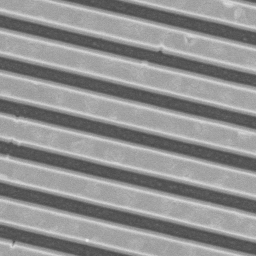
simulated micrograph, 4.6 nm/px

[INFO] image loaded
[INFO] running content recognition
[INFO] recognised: parallel lines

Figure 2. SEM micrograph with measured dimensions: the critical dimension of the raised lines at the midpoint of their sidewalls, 0.111 µm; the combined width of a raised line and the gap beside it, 40.9 px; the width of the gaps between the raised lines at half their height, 16.3 px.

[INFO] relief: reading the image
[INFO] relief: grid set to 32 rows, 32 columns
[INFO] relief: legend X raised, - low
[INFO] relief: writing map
XXXXXXXXX---------XXXXXXXXXXXXX-
XXXXXXXXXXXXX---------XXXXXXXXXX
----XXXXXXXXXXXXX---------XXXXXX
--------XXXXXXXXXXXXXX---------X
XXX----------XXXXXXXXXXXXX------
XXXXXXXX---------XXXXXXXXXXXXX--
XXXXXXXXXXXX---------XXXXXXXXXXX
---XXXXXXXXXXXXX---------XXXXXXX
-------XXXXXXXXXXXXX----------XX
XX----------XXXXXXXXXXXXX-------
XXXXXXX---------XXXXXXXXXXXXX---
XXXXXXXXXXX---------XXXXXXXXXXXX
--XXXXXXXXXXXXX---------XXXXXXXX
------XXXXXXXXXXXXX---------XXXX
X---------XXXXXXXXXXXXX---------
XXXXXX---------XXXXXXXXXXXXX----
XXXXXXXXXX---------XXXXXXXXXXXXX
-XXXXXXXXXXXXX---------XXXXXXXXX
-----XXXXXXXXXXXXX---------XXXXX
---------XXXXXXXXXXXXXX---------
XXXX---------XXXXXXXXXXXXX------
XXXXXXXXX---------XXXXXXXXXXXXX-
XXXXXXXXXXXXX---------XXXXXXXXXX
----XXXXXXXXXXXXX----------XXXXX
--------XXXXXXXXXXXXX----------X
XXX----------XXXXXXXXXXXXX------
XXXXXXX----------XXXXXXXXXXXXX--
XXXXXXXXXXXX---------XXXXXXXXXXX
---XXXXXXXXXXXXX---------XXXXXXX
-------XXXXXXXXXXXXXX--------XXX
XX---------XXXXXXXXXXXXXX-------
XXXXXX----------XXXXXXXXXXXXX---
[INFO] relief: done